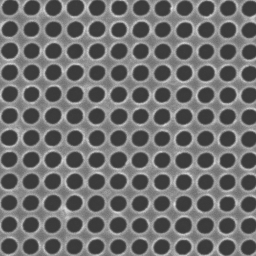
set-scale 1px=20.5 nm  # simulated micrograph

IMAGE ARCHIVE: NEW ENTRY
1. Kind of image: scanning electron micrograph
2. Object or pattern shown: a regular array of holes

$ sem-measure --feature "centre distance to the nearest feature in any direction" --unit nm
441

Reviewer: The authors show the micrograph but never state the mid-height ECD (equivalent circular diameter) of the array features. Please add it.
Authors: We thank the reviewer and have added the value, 0.337 µm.